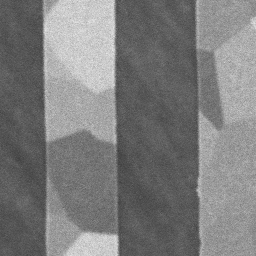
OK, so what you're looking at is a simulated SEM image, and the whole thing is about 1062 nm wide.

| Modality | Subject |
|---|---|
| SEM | one or a few lines or trenches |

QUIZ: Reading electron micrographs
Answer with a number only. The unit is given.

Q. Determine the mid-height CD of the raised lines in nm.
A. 288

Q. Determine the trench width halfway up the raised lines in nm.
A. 346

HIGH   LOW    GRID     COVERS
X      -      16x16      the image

---XXXX-----XXXX
---XXXX-----XXXX
---XXXX-----XXXX
---XXXX-----XXXX
---XXXX-----XXXX
---XXXX-----XXXX
---XXXX-----XXXX
---XXXX-----XXXX
---XXXX------XXX
---XXXX------XXX
---XXXX------XXX
---XXXX-----XXXX
---XXXX-----XXXX
---XXXX------XXX
---XXXX------XXX
---XXXX------XXX